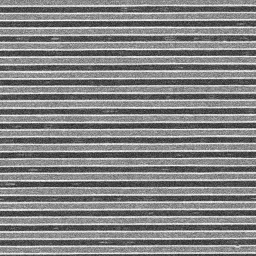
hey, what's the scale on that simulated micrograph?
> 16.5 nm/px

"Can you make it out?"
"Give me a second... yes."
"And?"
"parallel lines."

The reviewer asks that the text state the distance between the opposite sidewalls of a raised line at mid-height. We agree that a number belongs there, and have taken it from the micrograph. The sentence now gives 132 nanometers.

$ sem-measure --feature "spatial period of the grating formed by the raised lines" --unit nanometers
241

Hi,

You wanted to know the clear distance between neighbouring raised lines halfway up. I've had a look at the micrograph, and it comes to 117 nanometres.